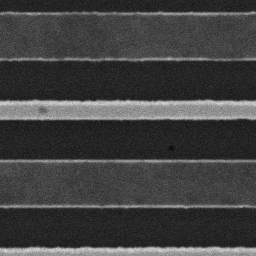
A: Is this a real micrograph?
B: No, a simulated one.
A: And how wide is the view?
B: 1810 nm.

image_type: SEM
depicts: lines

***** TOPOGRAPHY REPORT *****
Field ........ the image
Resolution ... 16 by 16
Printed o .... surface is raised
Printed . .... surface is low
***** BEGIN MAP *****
................
oooooooooooooooo
oooooooooooooooo
oooooooooooooooo
................
................
................
................
................
................
oooooooooooooooo
oooooooooooooooo
oooooooooooooooo
................
................
................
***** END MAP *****